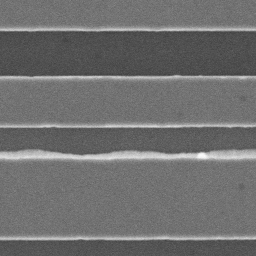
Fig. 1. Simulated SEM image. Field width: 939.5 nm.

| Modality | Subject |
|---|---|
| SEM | lines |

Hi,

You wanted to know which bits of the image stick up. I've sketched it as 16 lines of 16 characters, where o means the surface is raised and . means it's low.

oooooooooooooooo
oooooooooooooooo
................
................
................
oooooooooooooooo
oooooooooooooooo
oooooooooooooooo
oooooooooooooooo
oooooooooooooooo
oooooooooooooooo
oooooooooooooooo
oooooooooooooooo
oooooooooooooooo
oooooooooooooooo
................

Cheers